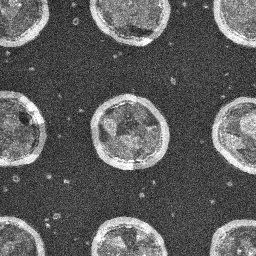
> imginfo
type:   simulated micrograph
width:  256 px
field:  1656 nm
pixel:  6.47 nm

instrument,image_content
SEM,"raised bodies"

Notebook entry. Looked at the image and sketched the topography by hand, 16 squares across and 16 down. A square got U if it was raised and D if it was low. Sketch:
UUUDDDUUUUDDDDUU
UUUDDDUUUUDDDDUU
UDDDDDDDUDDDDDDU
DDDDDDDDDDDDDDDD
DDDDDDDDDDDDDDDD
DDDDDDDDDDDDDDDD
UUDDDDDUUDDDDDDU
UUUDDDUUUUDDDDUU
UUUDDDUUUUDDDUUU
UUDDDDUUUUDDDDUU
DDDDDDDDDDDDDDDU
DDDDDDDDDDDDDDDD
DDDDDDDDDDDDDDDD
DDDDDDDDDDDDDDDD
UUDDDDUUUUDDDDUU
UUUDDDUUUUDDDUUU